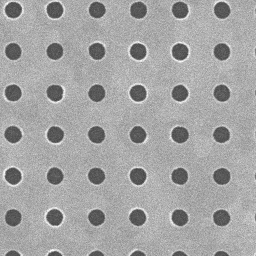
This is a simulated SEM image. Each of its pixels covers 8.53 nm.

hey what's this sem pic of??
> a regular array of holes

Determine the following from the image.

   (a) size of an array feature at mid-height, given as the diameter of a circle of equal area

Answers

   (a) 149 nm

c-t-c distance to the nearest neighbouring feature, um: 0.352